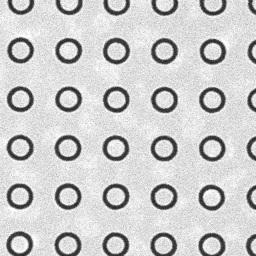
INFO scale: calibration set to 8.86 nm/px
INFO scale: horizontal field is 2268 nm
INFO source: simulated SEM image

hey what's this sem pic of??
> a regular array of ring-shaped grooves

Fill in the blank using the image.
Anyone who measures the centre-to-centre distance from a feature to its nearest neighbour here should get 424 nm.